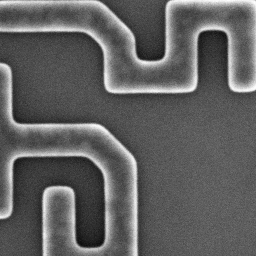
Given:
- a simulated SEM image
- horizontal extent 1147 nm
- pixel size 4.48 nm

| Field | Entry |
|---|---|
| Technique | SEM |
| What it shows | wiring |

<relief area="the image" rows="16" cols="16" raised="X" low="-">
XXXXXXX---XXXXXX
XXXXXXXX--XXXXXX
------XX--XX--XX
------XXX-XX--XX
X------XXXXX--XX
X------XXXXX---X
X---------------
X---------------
XXXXXXX---------
XXXXXXXX--------
X-----XXX-------
X------XX-------
X--XX--XX-------
---XX--XX-------
---XX--XX-------
---XXXXXX-------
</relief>